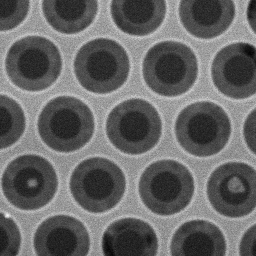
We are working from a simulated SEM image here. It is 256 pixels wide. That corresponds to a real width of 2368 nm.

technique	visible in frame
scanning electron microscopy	an array of small figures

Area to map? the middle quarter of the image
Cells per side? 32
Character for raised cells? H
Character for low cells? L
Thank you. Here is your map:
HHLLLHHHHHHHHHLLLHHLLLLHHHHHHHHL
HHLLLHHHHHHHHLLLLHHLLLHHHHHHHHHL
HHHLLLHHHHHHHLLLHHHLLLLHHHHHHHHL
HHHLLLLHHHHHLLLLHHHHLLLHHHHHHHLL
HHHLLLLLHHHLLLLLHHHHLLLLHHHHHLLL
HHHHLLLLLLLLLLLHHHHHHLLLLLLLLLLL
HHHHHLLLLLLLLHHHHHHHHHLLLLLLLLLH
HHHHHHHHLLLHHHHHHHHHHHHLLLLLLLHH
LLLLHHHHHHHHHHHHLLLHHHHHHHHHHHHH
LLLLLHHHHHHHHHLLLLLLLHHHHHHHHHHH
LLLLLLHHHHHHHLLLLLLLLLLHHHHHHHLL
HHHLLLLHHHHHLLLLLLLLLLLHHHHHHLLL
HHHHLLLHHHHLLLLHHHHHLLLLHHHHLLLL
HHHHLLLLHHHLLLHHHHHHHLLLHHHHLLLL
HHHHLLLLHHLLLLHHHHHHHHLLLHHHLLLH
HHHHLLLLHHLLLLHHHHHHHHLLLHHLLLLH
HHHHLLLLHHLLLLHHHHHHHHLLLHHLLLLH
HHHHLLLHHHLLLLHHHHHHHLLLLHHHLLLH
HHHLLLLHHHHLLLLHHHHHHLLLHHHHLLLH
LLLLLLHHHHHLLLLLHHHLLLLLHHHHLLLL
LLLLLHHHHHHHLLLLLLLLLLLHHHHHHLLL
LLLLHHHHHHHHHLLLLLLLLLHHHHHHHHLL
HHHHHHHHHHHHHHHLLLLLHHHHHHHHHHHL
HHHHHHLLLLLHHHHHHHHHHHHHHHHHHHHH
HHHHLLLLLLLLLHHHHHHHHHLLLLLLLHHH
HHHLLLLLLLLLLLHHHHHHHLLLLLLLLLHH
HHLLLLHHHHLLLLLHHHHHLLLLLLLLLLLH
HHLLLHHHHHHHLLLHHHHLLLLHHHHHLLLL
HLLLLHHHHHHHLLLLHHHLLLHHHHHHHLLL
HLLLHHHHHHHHHLLLHHLLLLHHHHHHHLLL
HLLLHHHHHHHHHLLLHHLLLHHHHHHHHHLL
HLLLLHHHHHHHLLLLHHLLLLHHHHHHHHLL